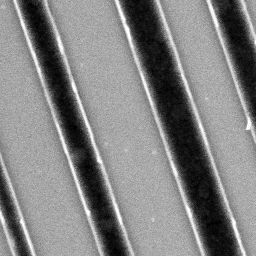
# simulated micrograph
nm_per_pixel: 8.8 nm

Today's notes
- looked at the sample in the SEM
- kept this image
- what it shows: one or a few lines or trenches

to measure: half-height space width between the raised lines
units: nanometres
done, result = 572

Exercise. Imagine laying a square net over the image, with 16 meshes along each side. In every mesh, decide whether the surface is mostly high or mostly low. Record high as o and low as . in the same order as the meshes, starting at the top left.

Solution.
.oo....ooo...oo.
.oo.....oo...ooo
..oo....ooo...oo
..oo....ooo...oo
..oo.....oo...oo
...oo....ooo...o
...oo....ooo...o
...oo.....oo...o
....oo....ooo...
....oo....ooo...
....oo.....oo...
o....oo....ooo..
o....oo....ooo..
o....oo.....ooo.
oo....oo....ooo.
.o....oo.....oo.